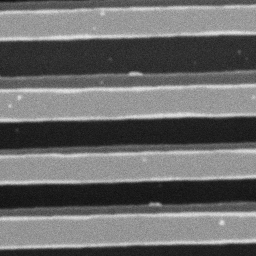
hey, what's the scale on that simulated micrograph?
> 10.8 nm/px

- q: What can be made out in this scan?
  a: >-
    lines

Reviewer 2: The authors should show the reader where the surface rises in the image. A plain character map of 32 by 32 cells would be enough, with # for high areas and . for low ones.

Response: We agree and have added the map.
################################
################################
################################
################################
####################............
................................
................................
................................
................................
............####################
################################
################################
################################
################################
##############################..
................................
................................
................................
........########################
################################
################################
################################
######################..........
................................
................................
...................#.........###
################################
################################
################################
################################
######################..........
................................